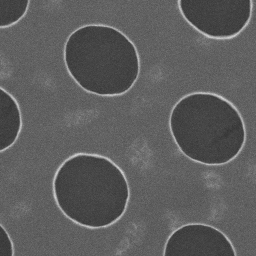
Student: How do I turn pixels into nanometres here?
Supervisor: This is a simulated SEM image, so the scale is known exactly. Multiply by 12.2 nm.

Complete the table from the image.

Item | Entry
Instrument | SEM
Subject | holes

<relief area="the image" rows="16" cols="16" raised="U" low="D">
DDUUUUUUUUUDDDDD
DUUUUUUUUUUUDDDU
UUUUDDDDUUUUUUUU
UUUUDDDDDUUUUUUU
UUUUDDDDDUUUUUUU
UUUUUDDDUUUUUUUU
DUUUUUUUUUUDDDUU
DUUUUUUUUUUDDDDU
DUUUUUUUUUUDDDDU
UUUUUUUUUUUUDDDU
UUUUDDDUUUUUUUUU
UUUDDDDDUUUUUUUU
UUUUDDDDUUUUUUUU
UUUUDDDUUUUUUUUU
UUUUUUUUUUUDDDUU
DUUUUUUUUUDDDDUU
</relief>